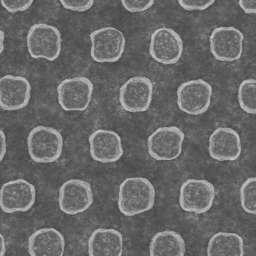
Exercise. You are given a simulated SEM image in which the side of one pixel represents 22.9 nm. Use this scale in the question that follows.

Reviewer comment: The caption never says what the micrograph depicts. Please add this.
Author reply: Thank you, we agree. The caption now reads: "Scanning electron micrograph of a regular array of raised bodies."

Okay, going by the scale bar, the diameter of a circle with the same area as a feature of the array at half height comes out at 748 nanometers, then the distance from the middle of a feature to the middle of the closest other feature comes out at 1.33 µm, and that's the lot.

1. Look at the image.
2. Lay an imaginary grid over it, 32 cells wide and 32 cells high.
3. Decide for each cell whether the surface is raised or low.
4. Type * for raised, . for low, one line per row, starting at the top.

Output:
****....***.....***....***....**
................................
................................
....***.........................
....***.....***....***.....***..
....***.....***....****....***..
....***.....***....****....***..
............**......**..........
................................
................................
***.....***.....***....***....**
****...****....****...****....**
***.....***....****...****....**
.*......***.....**.....***.....*
................................
................................
....***.....**......**.....**...
....****...****....****...****..
....***....****....****...****..
....***.....***....***.....***..
................................
................................
................**..............
****....***....****....***....**
****....***....****....***....**
****....***....****....***....**
........**......*...............
................................
................................
....****....***.....**.....***..
....****...****....****...****..
....****...****....****...****..